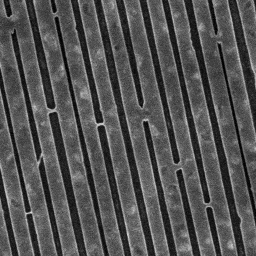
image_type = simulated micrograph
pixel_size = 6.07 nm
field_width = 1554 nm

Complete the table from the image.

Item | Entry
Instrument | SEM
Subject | parallel lines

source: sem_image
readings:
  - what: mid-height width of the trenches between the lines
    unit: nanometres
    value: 42.3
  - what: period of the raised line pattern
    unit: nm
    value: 134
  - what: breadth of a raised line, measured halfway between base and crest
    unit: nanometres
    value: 90.6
